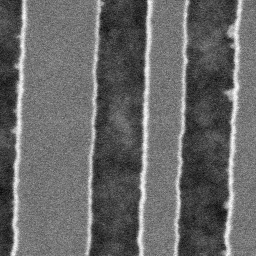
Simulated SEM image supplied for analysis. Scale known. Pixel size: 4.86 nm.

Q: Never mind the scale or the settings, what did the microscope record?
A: lines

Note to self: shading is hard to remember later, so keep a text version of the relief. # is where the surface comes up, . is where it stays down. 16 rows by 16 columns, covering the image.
.#####...###...#
.#####...###...#
.#####...###...#
.#####...###...#
.#####...###...#
.#####...###...#
.#####...###...#
.#####...##...##
.#####...##...##
.#####...##...##
.#####...##...##
.#####...##...##
.#####...##...##
.#####...##...##
.#####...##...##
.#####...##...##